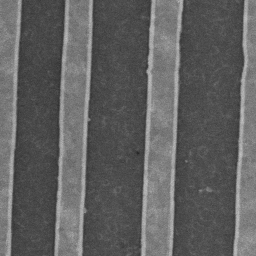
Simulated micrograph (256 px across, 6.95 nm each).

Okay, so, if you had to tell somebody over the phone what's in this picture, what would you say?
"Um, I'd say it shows one or a few lines or trenches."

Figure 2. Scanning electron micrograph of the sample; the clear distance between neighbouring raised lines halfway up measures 428 nm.